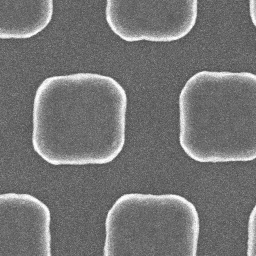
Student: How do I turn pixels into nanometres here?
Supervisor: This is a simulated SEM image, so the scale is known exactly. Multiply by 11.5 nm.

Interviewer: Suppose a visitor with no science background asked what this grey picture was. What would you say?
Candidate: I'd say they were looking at raised bodies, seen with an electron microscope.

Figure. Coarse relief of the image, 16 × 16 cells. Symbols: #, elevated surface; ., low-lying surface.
###....#####....
###....#####....
................
................
................
...####.....####
..######...#####
..######...#####
..######...#####
..#####.....####
................
................
##......###.....
###....#####....
###....#####....
###....#####....